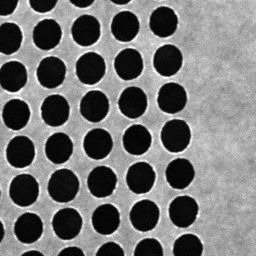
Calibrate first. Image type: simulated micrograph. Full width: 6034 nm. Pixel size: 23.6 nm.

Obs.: a regular array of holes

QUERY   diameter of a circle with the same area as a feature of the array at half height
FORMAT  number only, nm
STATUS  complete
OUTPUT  738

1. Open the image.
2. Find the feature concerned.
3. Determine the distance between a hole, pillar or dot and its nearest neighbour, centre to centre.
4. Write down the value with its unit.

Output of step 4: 894 nm